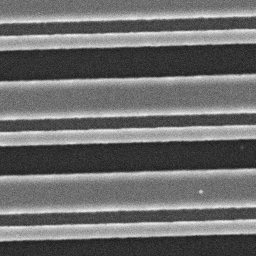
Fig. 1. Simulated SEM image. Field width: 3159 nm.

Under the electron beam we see lines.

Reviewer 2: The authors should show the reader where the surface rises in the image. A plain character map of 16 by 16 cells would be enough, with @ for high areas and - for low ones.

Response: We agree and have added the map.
@@@@@@@@@@@@@@@@
@@@@@@@@@@@@@@@@
@@@@@@@@@@@@@@@@
----------------
----------------
@@@@@@@@@@@@@@@@
@@@@@@@@@@@@@@@@
@@@@@@@@@@@@@@@@
@@@@@@@@@@@@@@@@
----------------
----------------
@@@@@@@@@@@@@@@@
@@@@@@@@@@@@@@@@
@@@@@@@@@@@@@@@@
@@@@@@@@@@@@@@@@
----------------